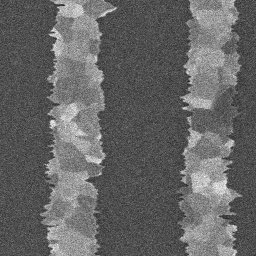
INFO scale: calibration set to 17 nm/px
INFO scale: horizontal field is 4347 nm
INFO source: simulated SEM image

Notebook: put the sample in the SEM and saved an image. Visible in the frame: one or a few lines or trenches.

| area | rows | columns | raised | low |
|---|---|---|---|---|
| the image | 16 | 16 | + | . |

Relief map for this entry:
....+++.....+++.
...+++......+++.
...+++......+++.
...+++......+++.
...+++......+++.
...+++......+++.
...+++......+++.
...+++......+++.
...+++......++..
...+++......++..
...+++......++..
...+++.....+++..
...+++.....++++.
...+++.....+++..
...+++.....++++.
...+++......+++.